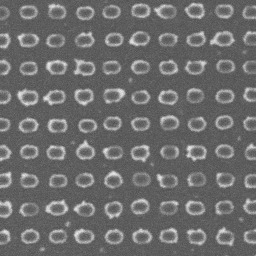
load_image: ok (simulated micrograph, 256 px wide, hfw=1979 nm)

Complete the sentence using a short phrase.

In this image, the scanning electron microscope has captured a regular array of raised bodies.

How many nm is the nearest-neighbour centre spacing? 208